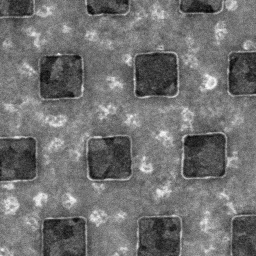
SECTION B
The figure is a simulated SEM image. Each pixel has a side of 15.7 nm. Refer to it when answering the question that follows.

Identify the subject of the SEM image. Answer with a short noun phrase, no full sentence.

raised bodies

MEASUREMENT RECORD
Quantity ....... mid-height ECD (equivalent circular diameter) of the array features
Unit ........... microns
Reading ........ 0.78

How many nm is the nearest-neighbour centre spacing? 1490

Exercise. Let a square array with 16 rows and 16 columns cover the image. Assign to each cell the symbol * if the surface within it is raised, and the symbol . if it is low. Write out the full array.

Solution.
**...***...***..
................
................
...**....**...**
..***...***...**
..***...***...**
................
................
.......*....**..
**...***...***..
**...***...***..
................
................
...............*
...**....**...**
...**....**...**